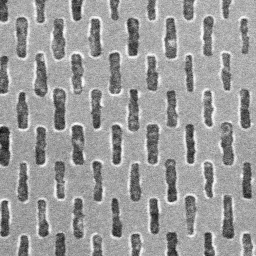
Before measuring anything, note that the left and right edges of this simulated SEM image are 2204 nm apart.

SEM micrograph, a regular array of holes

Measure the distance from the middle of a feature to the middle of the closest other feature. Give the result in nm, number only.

318